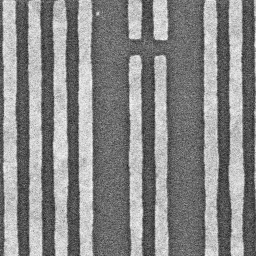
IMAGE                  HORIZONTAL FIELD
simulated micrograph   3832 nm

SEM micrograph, wiring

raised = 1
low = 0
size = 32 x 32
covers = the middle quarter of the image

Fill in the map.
00001110000000000110000110000000
00001110000000000110000110000000
00001110000000000110000110000000
00001110000000000110000110000000
00001110000000000110000110000000
00001110000000000110000110000000
00001110000000000110000110000000
00001110000000000110000110000000
00001110000000000110000110000000
00001110000000000110000110000000
00001110000000000110000110000000
00001110000000000110000110000000
00001110000000000110000110000000
00001110000000000110000110000000
00001110000000000110000111000000
00001110000000000110000111000000
00001110000000000110000111000000
10001110000000000110000111000000
10001110000000000110000111000000
10001110000000000110000111000000
10001110000000000110000111000000
10001110000000000110000111000000
10001110000000000110000111000000
10001110000000000110000111000000
10001110000000000110000111000000
10001110000000000110000111000000
10001110000000000110000111000000
10001110000000000110000111000000
10001110000000000110000111000000
10001110000000000110000110000000
10001110000000000110000110000000
10001110000000000110000111000000